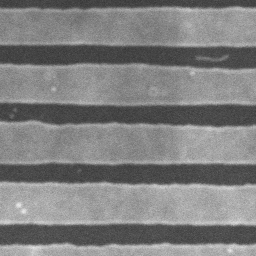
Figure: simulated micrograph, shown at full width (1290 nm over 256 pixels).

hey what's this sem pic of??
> lines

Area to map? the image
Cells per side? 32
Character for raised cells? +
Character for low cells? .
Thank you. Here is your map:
................................
++++++++++++++++++++++++++++++++
++++++++++++++++++++++++++++++++
++++++++++++++++++++++++++++++++
++++++++++++++++++++++++++++++++
++++++++++++++++++++++++++++++++
................................
................................
++++++++++++++++++++++++........
++++++++++++++++++++++++++++++++
++++++++++++++++++++++++++++++++
++++++++++++++++++++++++++++++++
++++++++++++++++++++++++++++++++
................................
................................
++++++.......++..+..............
++++++++++++++++++++++++++++++++
++++++++++++++++++++++++++++++++
++++++++++++++++++++++++++++++++
++++++++++++++++++++++++++++++++
.............++.................
................................
................................
++++++++++++++++++++++++++++++++
++++++++++++++++++++++++++++++++
++++++++++++++++++++++++++++++++
++++++++++++++++++++++++++++++++
++++++++++++++++++++++++++++++++
................................
................................
........+...........+......+....
++++++++++++++++++++++++++++++++